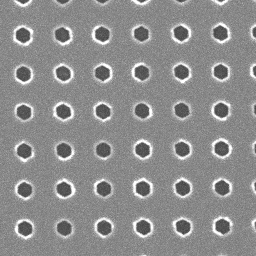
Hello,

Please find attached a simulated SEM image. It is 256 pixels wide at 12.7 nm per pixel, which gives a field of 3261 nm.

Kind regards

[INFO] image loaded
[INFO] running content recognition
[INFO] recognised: a regular array of holes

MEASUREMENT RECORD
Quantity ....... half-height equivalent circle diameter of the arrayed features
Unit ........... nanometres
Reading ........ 198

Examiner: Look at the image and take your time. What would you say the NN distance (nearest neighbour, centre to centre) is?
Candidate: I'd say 492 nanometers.